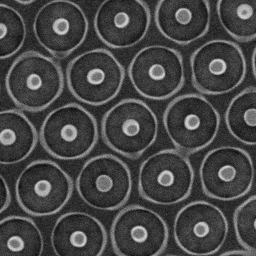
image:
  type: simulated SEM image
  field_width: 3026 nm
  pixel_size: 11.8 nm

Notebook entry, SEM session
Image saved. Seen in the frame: an array of small figures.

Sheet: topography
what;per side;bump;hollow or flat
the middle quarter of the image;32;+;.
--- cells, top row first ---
+.............+++.....++.....+++
+.............+++.....+++....+++
+.....++++.....++.....+++.....++
+.....++++.....++.............++
+......++.....+++.............++
++............++++...........+++
++............+++++.........++++
+++..........+++++++.......+++++
++++........+++++++++++.+++++...
++++++....+++++....++++++++.....
+..++++++++++.......++++++......
.....+++++++.........+++++......
......+++++...........+++.......
.......+++.............++......+
.......+++.............++......+
........++......++.....+++.....+
+++.....++.....+++.....+++......
+++.....++......++.....+++......
++......++.............++++.....
........+++...........++++++....
.......+++++.........+++++++....
......+++++++.......+++++++++...
.....++++++++++....+++++.....+++
...+++++.....+++++++++........++
++++++........++++++...........+
+++++..........+++++...........+
+++++...........+++.............
++++............+++......+......
.+++.....++.....+++.....+++.....
..+.....++++....+++.....+++.....
..++....++++.....++.............
..++.....++.....+++............+